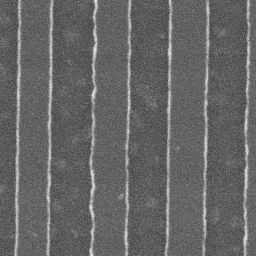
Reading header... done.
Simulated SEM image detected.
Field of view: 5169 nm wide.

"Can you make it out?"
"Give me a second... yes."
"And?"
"one or a few lines or trenches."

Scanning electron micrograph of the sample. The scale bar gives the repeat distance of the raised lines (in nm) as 1550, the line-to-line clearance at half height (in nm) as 820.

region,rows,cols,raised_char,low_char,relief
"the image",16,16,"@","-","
-@@---@@---@@---
-@@---@@---@@---
-@@---@@---@@--@
-@@---@@---@@--@
-@@---@@---@@--@
-@@---@@---@@--@
-@@---@@---@@--@
-@@---@@---@@--@
-@@---@@---@@--@
-@@---@@--@@@--@
-@@---@@--@@@--@
-@@---@@---@@--@
-@@---@@--@@@--@
-@@---@@--@@@--@
-@@---@@--@@@--@
-@@---@@--@@@--@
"